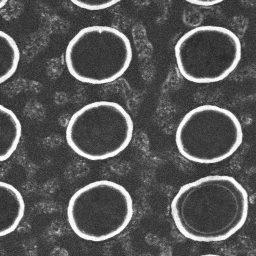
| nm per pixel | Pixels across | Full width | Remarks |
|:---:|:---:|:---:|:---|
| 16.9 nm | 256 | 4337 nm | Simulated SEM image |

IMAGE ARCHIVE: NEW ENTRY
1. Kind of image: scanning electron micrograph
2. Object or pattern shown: raised bodies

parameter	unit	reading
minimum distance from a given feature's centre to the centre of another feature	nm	1280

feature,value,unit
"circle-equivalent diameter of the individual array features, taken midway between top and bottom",987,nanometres